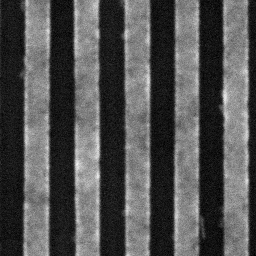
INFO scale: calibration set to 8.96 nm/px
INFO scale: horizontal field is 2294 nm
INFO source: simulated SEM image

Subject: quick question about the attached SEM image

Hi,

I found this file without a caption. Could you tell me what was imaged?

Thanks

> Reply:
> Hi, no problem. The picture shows lines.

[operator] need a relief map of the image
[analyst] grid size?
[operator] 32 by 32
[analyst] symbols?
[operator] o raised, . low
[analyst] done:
...ooo...ooo....ooo...ooo...ooo.
...ooo...ooo....ooo...ooo...ooo.
...ooo...ooo....ooo...ooo...ooo.
...ooo...ooo....ooo...ooo...ooo.
...ooo...ooo....ooo...ooo...ooo.
...ooo...ooo....ooo...ooo...ooo.
...ooo...ooo....ooo...ooo...ooo.
...ooo...ooo....ooo...ooo...ooo.
...ooo...ooo....ooo...ooo...ooo.
...ooo...ooo....ooo...ooo...ooo.
...ooo...ooo....ooo...ooo...ooo.
...ooo...ooo....ooo...ooo...ooo.
...ooo...ooo....ooo...ooo...ooo.
...ooo...ooo....ooo...ooo...ooo.
...ooo...ooo....ooo...ooo...ooo.
...ooo...ooo....ooo...ooo...ooo.
...ooo...ooo....ooo...ooo...ooo.
...ooo...ooo....ooo...ooo...ooo.
...ooo...ooo....ooo...ooo...ooo.
...ooo...ooo....ooo...ooo...ooo.
...ooo...ooo....ooo...ooo...ooo.
...ooo...ooo....ooo...ooo...ooo.
...ooo...ooo....ooo...ooo...ooo.
...ooo...ooo....ooo...ooo...ooo.
...ooo...ooo....ooo...ooo...ooo.
...ooo...ooo....ooo...ooo...ooo.
...ooo...ooo....ooo...ooo...ooo.
...ooo....oo....ooo...ooo...ooo.
...ooo....oo....ooo...ooo...ooo.
...ooo....oo....ooo...ooo...ooo.
...ooo....oo....ooo...ooo...ooo.
...ooo....oo....ooo...ooo...ooo.